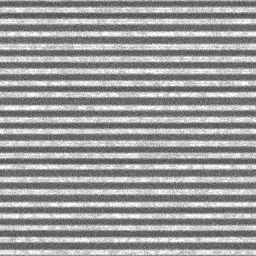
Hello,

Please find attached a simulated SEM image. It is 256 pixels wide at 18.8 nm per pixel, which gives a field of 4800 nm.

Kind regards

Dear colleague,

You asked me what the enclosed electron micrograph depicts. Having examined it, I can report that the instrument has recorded parallel lines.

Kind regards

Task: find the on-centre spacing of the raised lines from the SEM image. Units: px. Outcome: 12.1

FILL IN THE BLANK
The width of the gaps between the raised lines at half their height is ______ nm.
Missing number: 148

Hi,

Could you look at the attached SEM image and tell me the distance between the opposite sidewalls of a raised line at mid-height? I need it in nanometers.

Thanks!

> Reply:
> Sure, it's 82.